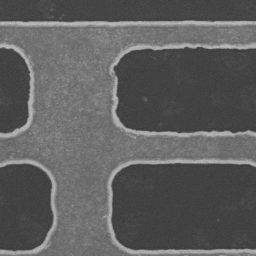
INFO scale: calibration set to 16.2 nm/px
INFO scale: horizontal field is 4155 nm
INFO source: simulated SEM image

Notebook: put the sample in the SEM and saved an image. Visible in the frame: one or a few lines or trenches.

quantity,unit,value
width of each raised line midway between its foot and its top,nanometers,436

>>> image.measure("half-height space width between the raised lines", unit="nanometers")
1430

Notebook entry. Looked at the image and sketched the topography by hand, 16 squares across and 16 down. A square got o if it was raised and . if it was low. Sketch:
................
oo.ooooooooooooo
oooooooooooooooo
.ooooooo........
..ooooo.........
..ooooo.........
..ooooo.........
..ooooo.........
oooooooooooooooo
oooooooooooooooo
...ooooo........
...oooo.........
...oooo.........
...oooo.........
...oooo.........
..oooooo........